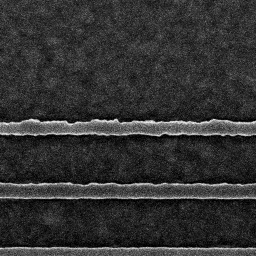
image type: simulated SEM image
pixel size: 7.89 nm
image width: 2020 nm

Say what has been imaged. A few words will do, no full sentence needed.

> one or a few lines or trenches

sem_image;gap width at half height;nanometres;390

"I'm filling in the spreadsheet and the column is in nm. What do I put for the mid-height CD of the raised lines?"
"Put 108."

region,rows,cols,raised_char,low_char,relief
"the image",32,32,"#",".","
................................
................................
................................
................................
................................
................................
................................
................................
................................
................................
................................
................................
................................
................................
................................
################################
################################
................................
................................
................................
................................
................................
................................
################################
################################
................................
................................
................................
................................
................................
................................
################################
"